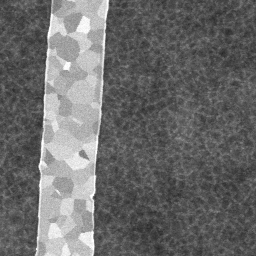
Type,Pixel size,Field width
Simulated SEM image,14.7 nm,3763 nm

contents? one or a few lines or trenches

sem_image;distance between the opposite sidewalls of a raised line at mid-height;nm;811